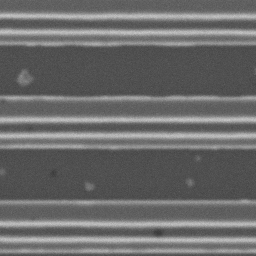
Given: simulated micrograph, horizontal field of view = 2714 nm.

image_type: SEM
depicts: lines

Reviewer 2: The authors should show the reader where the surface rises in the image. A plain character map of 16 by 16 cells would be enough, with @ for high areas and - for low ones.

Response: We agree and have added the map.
@@@@@@@@@@@@@@@@
@@@@@@@@@@@@@@@@
@@@@@@@@@@@@@@@@
----------------
----------------
----------------
@@@@@@@@@@@@@@@@
@@@@@@@@@@@@@@@@
@@@@@@@@@@@@@@@@
----------------
----------------
----------------
----------------
@@@@@@@@@@@@@@@@
@@@@@@@@@@@@@@@@
@@@@@@@@@@@@@@@@